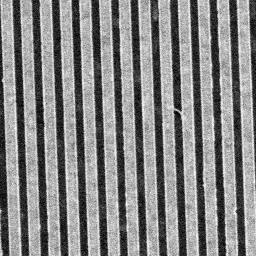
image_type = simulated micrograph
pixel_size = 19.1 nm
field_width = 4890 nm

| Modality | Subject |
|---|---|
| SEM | parallel lines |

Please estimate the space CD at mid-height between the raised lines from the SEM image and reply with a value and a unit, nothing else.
0.174 microns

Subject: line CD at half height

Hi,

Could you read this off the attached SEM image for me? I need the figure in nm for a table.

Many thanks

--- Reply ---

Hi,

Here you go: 205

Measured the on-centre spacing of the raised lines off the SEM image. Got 376 nanometers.